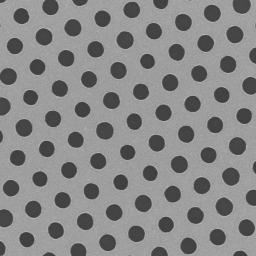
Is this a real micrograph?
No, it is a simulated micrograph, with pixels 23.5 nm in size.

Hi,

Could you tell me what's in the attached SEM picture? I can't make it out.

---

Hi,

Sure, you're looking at a regular array of holes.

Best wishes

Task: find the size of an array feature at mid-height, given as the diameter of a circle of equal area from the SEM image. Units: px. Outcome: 16.6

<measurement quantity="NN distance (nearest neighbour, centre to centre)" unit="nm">715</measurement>